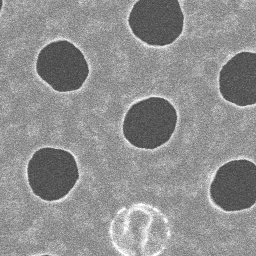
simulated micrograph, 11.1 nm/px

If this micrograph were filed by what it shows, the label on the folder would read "holes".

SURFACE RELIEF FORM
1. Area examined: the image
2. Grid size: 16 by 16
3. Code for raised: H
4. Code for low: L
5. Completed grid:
HHHHHHHHLLLHHHHH
HHHHHHHHLLLHHHHH
HHHHHHHHHLLHHHHH
HHLLLHHHHHHHHHHL
HHLLLHHHHHHHHHLL
HHHLLHHHHHHHHHLL
HHHHHHHHLLLHHHHL
HHHHHHHHLLLHHHHH
HHHHHHHHLLLHHHHH
HHLLHHHHHHHHHHHH
HHLLLHHHHHHHHHLL
HHLLLHHHHHHHHLLL
HHHHHHHHHHHHHLLL
HHHHHHHHHHHHHHHH
HHHHHHHHHHHHHHHH
HHHHHHHHHHHHHHHH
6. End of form